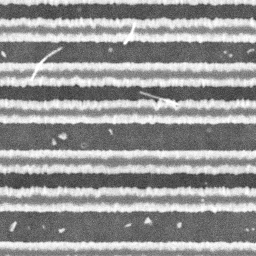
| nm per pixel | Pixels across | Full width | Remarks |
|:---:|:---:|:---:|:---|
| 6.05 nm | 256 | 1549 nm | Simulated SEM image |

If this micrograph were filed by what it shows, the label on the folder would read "lines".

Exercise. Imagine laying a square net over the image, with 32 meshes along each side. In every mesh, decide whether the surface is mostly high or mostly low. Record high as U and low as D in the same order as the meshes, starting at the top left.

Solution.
DDDDDDDDDDDDDDDDDDDDDDDDDDDDDDDD
DDDDDDDDDDDDDDDDDDDDDDDDDDDDDDDD
DDUUUUDDDDUUUDDDUDDDUDDDDUDUDDDD
UUUUUUUUUUUUUUUUUUUUUUUUUUUUUUUU
UUUUUUUUUUUUUUUUUUUUUUUUUUUUUUUU
DDDDDDDDDDDDDDDDDDDDDDDDDDDDDDDD
DDDDDDDDDDDDDDDDDDDDDDDDDDDDDDDD
DDDDDDDDDDDDDDDDDDDDDDDDDDDDDDDD
UUUUUUUUUUUUUUUUUUUUUUUUUUUUUUUU
UUUUUUUUUUUUUUUUUUUUUUUUUUUUUUUU
UUUUUUUUUDUUUDUUUUUUUUUUUUUUUUUU
DDDDDDDDDDDDDDDDDDDDDDDDDDDDDDDD
DDDDDDDDDDDDDDDDDDDDDDDDDDDDDDDD
UUUUUUUUUUUUUUUUUUUUUUUUUUUUUUUU
UUUUUUUUUUUUUUUUUUUUUUUUUUUUUUUU
DDDDDDDDDDDDDDDDDDDDDDDDDDDDDDDD
DDDDDDDDDDDDDDDDDDDDDDDDDDDDDDDD
DDDDDDDDDDDDDDDDDDDDDDDDDDDDDDDD
DDDDDDDDDDDDDDDDDDDDDDDDDDDDDDDD
UUUUUUUUUUUUUUUUUUUUUUUUUUUUUUUU
UUUUUUUUUUUUUUUUUUUUUUUUUUUUUUUU
DDDDDDDDDDDDDUUDDDDDDUDDUDUUDUDD
DDDDDDDDDDDDDDDDDDDDDDDDDDDDDDDD
DDDDDDDDDDDDDDDDDDDDDDDDDDDDDDDD
UUUUUUUUUUUUUUUUUUUUUUUUUUUUUUUU
UUUUUUUUUUUUUUUUUUUUUUUUUUUUUUUU
DDDDDDDDDDDDDDDDDDDDDDDDDDDDDDDD
DDDDDDDDDDDDDDDDDDDDDDDDDDDDDDDD
DDDDDDDDDDDDDDDDDDDDDDDDDDDDDDDD
DDDDDDDDDDDDDDDDDDDDDDDDDDDDDDDD
UDUDDDUDDDDUDDDUDDDDDDDDDDDDDDDD
UUUUUUUUUUUUUUUUUUUUUUUUUUUUUUUU